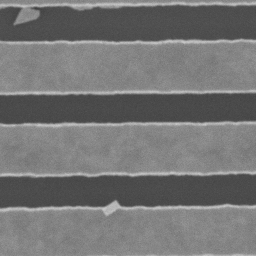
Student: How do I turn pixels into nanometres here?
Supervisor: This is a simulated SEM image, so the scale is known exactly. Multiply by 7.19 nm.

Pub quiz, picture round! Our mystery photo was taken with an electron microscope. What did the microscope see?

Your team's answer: lines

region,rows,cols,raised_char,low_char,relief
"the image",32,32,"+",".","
++++++++++++++++++++++.+++++++++
................................
................................
................................
................................
++++++++++++++++++++++++++++++++
++++++++++++++++++++++++++++++++
++++++++++++++++++++++++++++++++
++++++++++++++++++++++++++++++++
++++++++++++++++++++++++++++++++
++++++++++++++++++++++++++++++++
+++++++++++++++++++++++++++++++.
................................
................................
................................
...++..+++++++++++++++++++++++++
++++++++++++++++++++++++++++++++
++++++++++++++++++++++++++++++++
++++++++++++++++++++++++++++++++
++++++++++++++++++++++++++++++++
++++++++++++++++++++++++++++++++
++++++++++++++++++++++++++++++++
................................
................................
................................
..............+.................
++++++++++++++++++++++++++++++++
++++++++++++++++++++++++++++++++
++++++++++++++++++++++++++++++++
++++++++++++++++++++++++++++++++
++++++++++++++++++++++++++++++++
++++++++++++++++++++++++++++++++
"